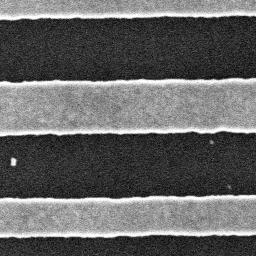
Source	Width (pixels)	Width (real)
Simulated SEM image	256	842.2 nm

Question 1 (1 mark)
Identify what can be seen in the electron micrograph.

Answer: lines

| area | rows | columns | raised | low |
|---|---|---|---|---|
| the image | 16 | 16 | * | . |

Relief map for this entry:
****************
................
................
................
................
****************
****************
****************
................
................
................
................
****************
****************
****************
................